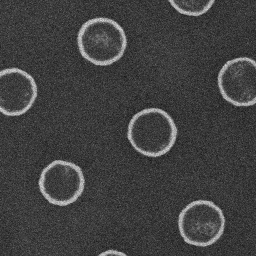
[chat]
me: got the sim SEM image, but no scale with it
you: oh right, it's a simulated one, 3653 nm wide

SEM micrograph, raised bodies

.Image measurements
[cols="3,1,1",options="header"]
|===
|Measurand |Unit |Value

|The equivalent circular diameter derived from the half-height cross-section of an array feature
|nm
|625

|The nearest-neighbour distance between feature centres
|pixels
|103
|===